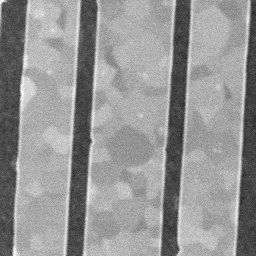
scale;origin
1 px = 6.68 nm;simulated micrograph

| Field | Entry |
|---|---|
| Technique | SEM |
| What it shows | one or a few lines or trenches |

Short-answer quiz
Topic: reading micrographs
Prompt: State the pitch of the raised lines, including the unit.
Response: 83.4 pixels